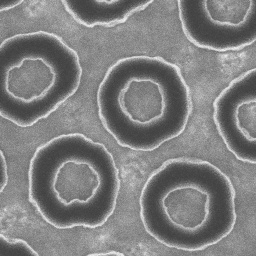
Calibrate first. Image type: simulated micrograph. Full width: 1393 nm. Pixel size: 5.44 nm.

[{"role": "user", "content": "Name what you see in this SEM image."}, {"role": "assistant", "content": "ring-shaped raised bodies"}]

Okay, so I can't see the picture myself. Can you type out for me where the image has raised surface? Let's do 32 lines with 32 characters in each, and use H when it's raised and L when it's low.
HHLLLLLLHHHHHHHHHHHLLLHHHHLLLLLH
LLLLLLLLLHHHHHHHHLLLLLHHHHLLLLLH
LLLLLLLLLLHHHHHHLLLLLLLHHHHLLLHH
LLLLLLLLLLLLLLLLLLLLLLLHHHHHHHHH
LLHHHHHLLLLLLLLLLLLLLLLHHHHHHHHH
HHHHHHHHLLLLLLLLLLLLLLLLHHHHHHHL
HHHHHHHHHLLLLLLLLLLLLLLLLLLLLLLL
HHHLHHHHHHLLLLLHHHHHLLLLLLLLLLLL
HHLLLLHHHHLLLLHHHHHHHHLLLLLLLLLL
HLLLLLLHHHLLLHHHHHHHHHHLLLLLLLHH
HLLLLLHHHHLLLHHHLLLHHHHLLLLLLHHH
HLLLLHHHHLLLHHHHLLLLHHHHLLLLHHHH
HHHHHHHHLLLLHHHLLLLLHHHHLLLHHHHH
HHHHHHHLLLLLHHHHLLLLHHHHLLLHHHLL
HHHHHHLLLLLLLHHHLLLLHHHHLLLHHHLL
LLHHLLLLLLLLLHHHHHHHHHHLLLLHHHLL
LLLLLLLLLLLLLLHHHHHHHHHLLLLHHHHL
LLLLLLHHHHHLLLLHHHHHHLLLLLLLHHHH
LLLLLHHHHHHHHLLLHHHLLLLLLLLLHHHH
LLLLHHHHHHHHHHLLLLLLLLLLLLLLLHHH
HLLLHHHHLLLHHHLLLLLLLHHHHHLLLLLL
HLLLHHHLLLLLHHHLLLLHHHHHHHHHLLLL
HLLLHHHLLLLLHHHLLLHHHHHHHHHHHLLL
HLLLHHHLLLLLHHHLLLHHHHHHHHHHHLLL
LLLLHHHLLLLHHHHLLLHHHLLLLLHHHLLL
LLLLHHHHHHHHHHLLLLHHHLLLLLHHHLLL
LLLLLHHHHHHHHHLLLLHHHLLLLLHHHLLL
LLLLLLHHHHHHHLLLLLHHHHLLLHHHHLLL
LLLLLLLHLLLLLLLLLLHHHHHHHHHHHLLL
LLLLLLLLLLLLLLLLLLLHHHHHHHHHLLLL
HHHLLLLLLLLLLLLLLLLLHHHHHHHLLLLL
HHHHLLLLLLLLLLLLLLLLLLLLLLLLLLLL